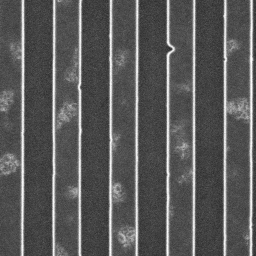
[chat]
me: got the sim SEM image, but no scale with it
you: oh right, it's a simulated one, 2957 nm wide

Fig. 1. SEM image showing parallel lines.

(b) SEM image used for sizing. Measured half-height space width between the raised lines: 351 nanometres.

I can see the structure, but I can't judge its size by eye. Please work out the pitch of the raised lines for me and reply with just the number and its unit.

0.658 micrometres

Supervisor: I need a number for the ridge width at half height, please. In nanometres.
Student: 303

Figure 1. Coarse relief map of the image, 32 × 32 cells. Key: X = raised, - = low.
XXX----XXX----XXX----XXX----XXX-
XXX----XXX----XXX----XXX----XXX-
XXX----XXX----XXX----XXX----XXX-
XXX----XXX----XXX----XXX----XXX-
XXX----XXX----XXX----XXX----XXX-
XXX----XXX----XXX----XXX----XXX-
XXX----XXX----XXX----XXX----XXX-
XXX----XXX----XXX----XXX----XXX-
XXX----XXX----XXX----XXX----XXX-
XXX----XXX----XXX----XXX----XXX-
XXX----XXX----XXX----XXX----XXX-
XXX----XXX----XXX----XXX----XXX-
XXX----XXX----XXX----XXX----XXX-
XXX----XXX----XXX----XXX----XXX-
XXX----XXX----XXX----XXX----XXX-
XXX----XXX----XXX----XXX----XXX-
XXX----XXX----XXX----XXX----XXX-
XXX----XXX----XXX----XXX----XXX-
XXX----XXX----XXX----XXX----XXX-
XXX----XXX----XXX----XXX----XXX-
XXX----XXX----XXX----XXX----XXX-
XXX----XXX----XXX----XXX----XXX-
XXX----XXX----XXX----XXX----XXX-
XXX----XXX----XXX----XXX----XXX-
XXX----XXX----XXX----XXX----XXX-
XXX----XXX----XXX----XXX----XXX-
XXX----XXX----XXX----XXX----XXX-
XXX----XXX----XXX----XXX----XXX-
XXX----XXX----XXX----XXX----XXX-
XXX----XXX----XXX----XXX----XXX-
XXX----XXX----XXX----XXX----XXX-
XXX----XXX----XXX----XXX----XXX-